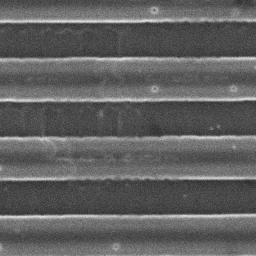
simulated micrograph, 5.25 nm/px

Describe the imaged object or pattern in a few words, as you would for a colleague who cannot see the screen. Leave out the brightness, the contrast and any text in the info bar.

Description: wiring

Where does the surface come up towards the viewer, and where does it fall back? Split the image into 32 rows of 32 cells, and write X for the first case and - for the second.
XXXXXXXXXXXXXXXXXXXXXXXXXXXXXXXX
XXXXXXXXXXXXXXXXXXXXXXXXXXXXXXXX
XXXXXXXXXXXXXXXXXXXXXXXXXXXX-XXX
--------------------------------
--------------------------------
--------------------------------
--------------------------------
XXXXXXXXXXXXXXXXXXXXXXXXXXXXXXXX
XXXXXXXXXXXXXXXXXXXXXXXXXXXXXXXX
XXXXXXXXXXXXXXXXXXXXXXXXXXXXXXXX
XXXXXXXXXXXXXXXXXXXXXXXXXXXXXXXX
XXXXXXXXXXXXXXXXXXXXXXXXXXXXXXXX
XXXXXXXXXXXXXXXXXXXXXXXXXXXXXXX-
--------------------------------
--------------------------------
--------------------------------
--------------------------------
XXXXXXXX-----XXXXXXXXXXXXXXXXXXX
XXXXXXXXXXXXXXXXXXXXXXXXXXXXXXXX
XXXXXXXXXXXXXXXXXXXXXXXXXXXXXXXX
XXXXXXXXXXXXXXXXXXXXXXXXXXXXXXXX
XXXXXXXXXXXXXXXXXXXXXXXXXXXXXXXX
--------------------------------
--------------------------------
--------------------------------
--------------------------------
--------------------------------
XXXXXXXXXXXXXXXXXXXXXXXXXXXXXXXX
XXXXXXXXXXXXXXXXXXXXXXXXXXXXXXXX
XXXXXXXXXXXXXXXXXXXXXXXXXXXXXXXX
XXXXXXXXXXXXXXXXXXXXXXXXXXXXXXXX
XXXXXXXXXXXXXXXXXXXXXXXXXXXXXXXX